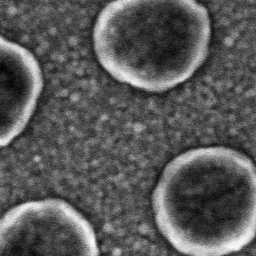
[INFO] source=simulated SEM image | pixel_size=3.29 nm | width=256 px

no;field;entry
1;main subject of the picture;raised bodies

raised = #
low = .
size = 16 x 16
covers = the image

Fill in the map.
.......#####....
......#######...
......#######...
##....#######...
##.....#####....
##..............
##..............
##..............
#...............
............##..
...........#####
..........######
..........######
.####.....######
######....######
######......##..